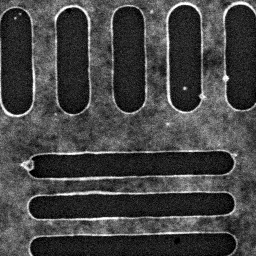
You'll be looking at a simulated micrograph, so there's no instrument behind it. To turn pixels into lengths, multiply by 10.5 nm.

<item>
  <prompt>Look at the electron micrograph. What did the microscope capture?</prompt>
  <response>groups of lines, slits or small figures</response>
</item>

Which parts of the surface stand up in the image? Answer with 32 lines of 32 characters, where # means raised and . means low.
################################
#..#####...###....###....###....
....###....###....###....###....
....###....###....###....###....
....###....###....###....###....
....###....###....###....###....
....###....###....###....###....
....###....###....###....###....
....###....###....###....###....
....###....###....###....###....
....###....###....###....###....
....###....###....###....###....
....###....###....###....###....
....####...####...####...####..#
################################
################################
################################
################################
################################
####.........................###
####.........................###
####.........................###
################################
################################
#####........................###
####.........................###
####.........................###
################################
################################
#####........................###
####..........................##
####.........................###